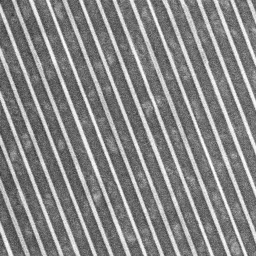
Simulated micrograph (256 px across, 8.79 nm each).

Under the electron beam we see parallel lines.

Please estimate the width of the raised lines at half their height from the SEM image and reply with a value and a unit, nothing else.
29.7 nanometres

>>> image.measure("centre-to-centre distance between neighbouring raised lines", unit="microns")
0.138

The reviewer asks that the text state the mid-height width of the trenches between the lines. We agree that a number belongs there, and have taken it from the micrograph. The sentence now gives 111 nm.